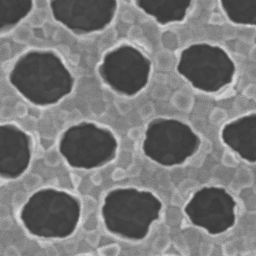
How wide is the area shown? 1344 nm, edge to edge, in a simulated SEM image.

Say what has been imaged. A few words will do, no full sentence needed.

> a regular array of holes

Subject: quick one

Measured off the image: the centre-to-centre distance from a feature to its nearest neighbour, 80.2 px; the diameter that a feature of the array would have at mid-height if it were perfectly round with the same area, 268 nm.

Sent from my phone